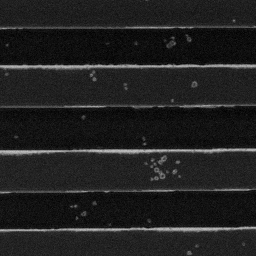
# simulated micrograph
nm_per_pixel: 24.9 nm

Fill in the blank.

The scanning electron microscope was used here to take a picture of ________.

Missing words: lines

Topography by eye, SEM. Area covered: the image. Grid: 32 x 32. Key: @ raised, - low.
@@@@@@@@@@@@@@@@@@@@@@@@@@@@@@@@
@@@@@@@@@@@@@@@@@@@@@@@@@@@@@@@@
@@@@@@@@@@@@@@@@@@@@@@@@@@@@@@@@
@-------------------------------
--------------------------------
--------------------------------
--------------------------------
--------------------------------
@@@@@@@@@@@@@@@@@@@@@@@@@@@@@@@@
@@@@@@@@@@@@@@@@@@@@@@@@@@@@@@@@
@@@@@@@@@@@@@@@@@@@@@@@@@@@@@@@@
@@@@@@@@@@@@@@@@@@@@@@@@@@@@@@@@
@@@@@@@@@@@@@@@@@@@@@@@@@@@@@@@@
--------------------------------
--------------------------------
--------------------------------
--------------------------------
--------------------------------
--------------------------------
@@@@@@@@@@@@@@@@@@@@@@@@@@@@@@@@
@@@@@@@@@@@@@@@@@@@@@@@@@@@@@@@@
@@@@@@@@@@@@@@@@@@@@@@@@@@@@@@@@
@@@@@@@@@@@@@@@@@@@@@@@@@@@@@@@@
@@@@@@@@@@@@@@@@@@@@@@@@@@@@@@@@
--------------------------------
--------------------------------
--------------------------------
--------------------------------
--------------------------------
@@@@@@@@@@@@@@@@@@@@@@@@@@@@@@@@
@@@@@@@@@@@@@@@@@@@@@@@@@@@@@@@@
@@@@@@@@@@@@@@@@@@@@@@@@@@@@@@@@